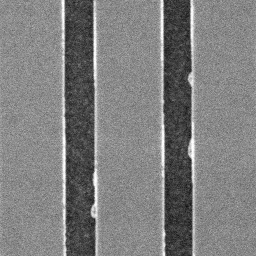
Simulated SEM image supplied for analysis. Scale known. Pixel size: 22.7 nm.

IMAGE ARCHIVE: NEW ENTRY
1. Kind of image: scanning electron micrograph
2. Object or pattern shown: lines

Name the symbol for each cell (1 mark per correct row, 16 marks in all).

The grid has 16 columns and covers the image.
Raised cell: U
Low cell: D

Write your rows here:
UUUUDDUUUUDDUUUU
UUUUDDUUUUDDUUUU
UUUUDDUUUUDDUUUU
UUUUDDUUUUDDUUUU
UUUUDDUUUUDDUUUU
UUUUDDUUUUDDUUUU
UUUUDDUUUUDDUUUU
UUUUDDUUUUDDUUUU
UUUUDDUUUUDDUUUU
UUUUDDUUUUDDUUUU
UUUUDDUUUUDDUUUU
UUUUDDUUUUDDUUUU
UUUUDDUUUUDDUUUU
UUUUDDUUUUDDUUUU
UUUUDDUUUUDDUUUU
UUUUDDUUUUDDUUUU